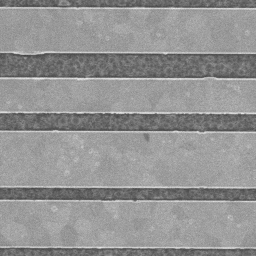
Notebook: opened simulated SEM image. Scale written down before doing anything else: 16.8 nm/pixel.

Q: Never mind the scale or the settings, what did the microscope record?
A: one or a few lines or trenches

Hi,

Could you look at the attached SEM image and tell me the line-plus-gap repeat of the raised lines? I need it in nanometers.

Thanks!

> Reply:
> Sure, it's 1080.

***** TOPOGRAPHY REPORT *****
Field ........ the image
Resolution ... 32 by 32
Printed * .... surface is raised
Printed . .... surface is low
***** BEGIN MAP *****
................................
********************************
********************************
********************************
********************************
********************************
.*****.........*****************
................................
................................
................................
********************************
********************************
********************************
********************************
................................
................................
*************************.......
********************************
********************************
********************************
********************************
********************************
********************************
................................
................................
********************************
********************************
********************************
********************************
********************************
********************************
................................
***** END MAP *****